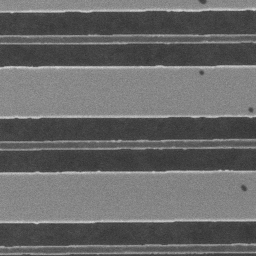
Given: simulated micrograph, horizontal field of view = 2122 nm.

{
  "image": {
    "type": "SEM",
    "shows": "lines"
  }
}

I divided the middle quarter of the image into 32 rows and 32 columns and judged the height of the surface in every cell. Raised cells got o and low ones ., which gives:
................................
oooooooooooooooooooooooooooooooo
oooooooooooooooooooooooooooooooo
oooooooooooooooooooooooooooooooo
oooooooooooooooooooooooooooooooo
oooooooooooooooooooooooooooooooo
oooooooooooooooooooooooooooooooo
oooooooooooooooooooooooooooooooo
oooooooooooooooooooooooooooooooo
oooooooooooooooooooooooooooooooo
oooooooooooooooooooooooooooooooo
oooooooooooooooooooooooooooooooo
oooooooooooooooooooooooooooooooo
................................
................................
................................
................................
................................
................................
.o.ooooooooooooooooooooooooooooo
oooooooooooooooooooooooooooooooo
................................
................................
................................
................................
................................
................................
oooooooooooooooooooooooooooooooo
oooooooooooooooooooooooooooooooo
oooooooooooooooooooooooooooooooo
oooooooooooooooooooooooooooooooo
oooooooooooooooooooooooooooooooo